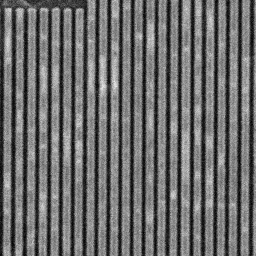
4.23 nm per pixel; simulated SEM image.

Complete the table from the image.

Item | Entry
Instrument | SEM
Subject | parallel lines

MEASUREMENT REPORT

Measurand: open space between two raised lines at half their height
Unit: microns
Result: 0.0212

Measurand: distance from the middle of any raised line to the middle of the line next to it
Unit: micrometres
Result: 0.0504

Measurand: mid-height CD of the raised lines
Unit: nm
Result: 29.1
